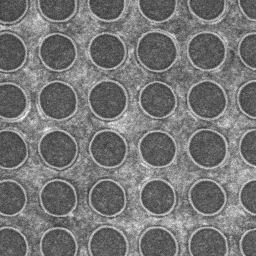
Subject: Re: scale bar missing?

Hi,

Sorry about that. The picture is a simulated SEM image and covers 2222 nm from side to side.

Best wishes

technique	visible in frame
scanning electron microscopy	a regular array of raised bodies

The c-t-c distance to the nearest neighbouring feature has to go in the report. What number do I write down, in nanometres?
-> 422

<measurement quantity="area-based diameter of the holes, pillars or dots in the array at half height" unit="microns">0.325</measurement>